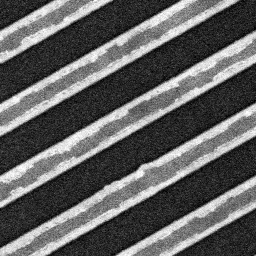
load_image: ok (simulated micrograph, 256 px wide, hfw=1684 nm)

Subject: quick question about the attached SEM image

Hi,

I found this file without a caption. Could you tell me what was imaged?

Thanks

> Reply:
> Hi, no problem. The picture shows one or a few lines or trenches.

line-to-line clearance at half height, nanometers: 272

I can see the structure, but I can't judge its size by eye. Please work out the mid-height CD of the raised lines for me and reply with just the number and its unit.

144 nm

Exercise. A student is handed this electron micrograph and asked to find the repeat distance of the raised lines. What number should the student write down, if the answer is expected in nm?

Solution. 414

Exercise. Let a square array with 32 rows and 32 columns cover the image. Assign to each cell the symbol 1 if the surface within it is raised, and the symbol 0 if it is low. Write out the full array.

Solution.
00000001111100000000000111110000
00000111110000000000011111000000
00011111100000000001111110000000
00111110000000000111111000000000
11111000000000001111100000000000
11100000000000111110000000000011
11000000000011111100000000001111
00000000001111110000000000011111
00000000011111000000000001111100
00000001111100000000000111110000
00000111111000000000011111000000
00011111100000000001111110000000
00111110000000000011111000000000
11111000000000001111100000000000
11110000000000111110000000000011
11000000000011111100000000001111
00000000000111110000000000111111
00000000011111000000000001111100
00000001111100000000000111110000
00000111111000000000011111100000
00001111100000000001111110000000
00111110000000000111111000000000
11111000000000001111100000000000
11110000000000111111000000000011
11000000000011111100000000001111
00000000000111110000000000011111
00000000011111000000000001111100
00000001111110000000000111110000
00000111111000000000011111100000
00001111100000000000111110000000
00111110000000000011111000000000
11111100000000001111100000000000